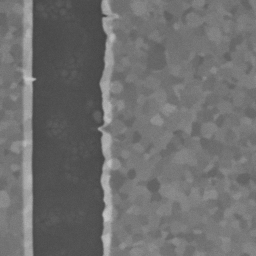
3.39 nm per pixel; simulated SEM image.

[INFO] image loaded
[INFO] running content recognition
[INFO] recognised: one or a few lines or trenches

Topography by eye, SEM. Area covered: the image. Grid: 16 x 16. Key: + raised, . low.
++.....+++++++++
++.....+++++++++
++.....+++++++++
++.....+++++++++
++.....+++++++++
++.....+++++++++
++.....+++++++++
++.....+++++++++
++....++++++++++
++.....+++++++++
++.....+++++++++
++.....+++++++++
++.....+++++++++
++.....+++++++++
++.....+++++++++
++.....+++++++++